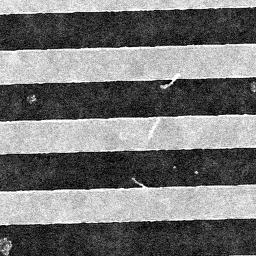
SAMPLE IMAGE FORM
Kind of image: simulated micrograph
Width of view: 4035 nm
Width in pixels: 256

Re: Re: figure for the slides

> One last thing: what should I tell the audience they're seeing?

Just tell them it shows lines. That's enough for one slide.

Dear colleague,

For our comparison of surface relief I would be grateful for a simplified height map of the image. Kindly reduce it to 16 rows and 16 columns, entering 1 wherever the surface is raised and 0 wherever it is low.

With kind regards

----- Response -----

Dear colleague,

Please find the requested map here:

1111111111111100
0000000000000000
0000000000000000
1111111111111111
1111111111111111
0000000000000000
0000000000000000
0000011111111111
1111111111111111
1110000000000000
0000000000000000
0000000000000000
1111111111111111
1111111111111111
0000000000000000
0000000000000000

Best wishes